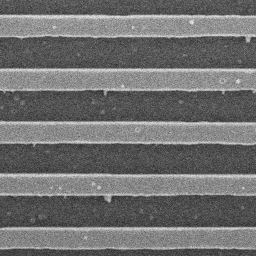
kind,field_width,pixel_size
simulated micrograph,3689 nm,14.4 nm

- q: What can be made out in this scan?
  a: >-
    lines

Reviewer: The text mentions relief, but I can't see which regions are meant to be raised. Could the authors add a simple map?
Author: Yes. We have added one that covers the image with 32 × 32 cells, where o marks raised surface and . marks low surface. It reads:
................................
................................
oooooooooooooooooooooooooooooooo
oooooooooooooooooooooooooooooooo
oooooooooooooooooooooooooo...ooo
................................
................................
................................
................................
oooooooooooooooooooooooooooooooo
oooooooooooooooooooooooooooooooo
................................
................................
................................
................................
oooooooooooooooooooooooooooooooo
oooooooooooooooooooooooooooooooo
oooooooooooooooooooooooooooooooo
................................
................................
................................
................................
oooooooooooooooooooooooooooooooo
oooooooooooooooooooooooooooooooo
................................
................................
................................
................................
oooooooooooooooooooooooooooooooo
oooooooooooooooooooooooooooooooo
oooooooooooooooooooooooooooooooo
................................